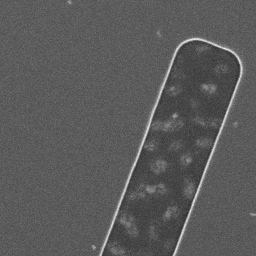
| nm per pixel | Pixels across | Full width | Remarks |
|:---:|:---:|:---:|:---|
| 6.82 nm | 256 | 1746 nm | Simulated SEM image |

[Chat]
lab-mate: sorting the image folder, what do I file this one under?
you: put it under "one or a few lines or trenches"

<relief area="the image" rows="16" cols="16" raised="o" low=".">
oooooooooooooooo
oooooooooooooooo
oooooooooooo.ooo
ooooooooooo....o
ooooooooooo....o
oooooooooo.....o
oooooooooo....oo
ooooooooo.....oo
ooooooooo.....oo
ooooooooo....ooo
oooooooo.....ooo
oooooooo.....ooo
oooooooo....oooo
ooooooo.....oooo
ooooooo....ooooo
oooooo.....ooooo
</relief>